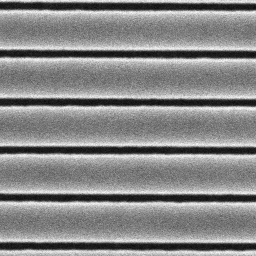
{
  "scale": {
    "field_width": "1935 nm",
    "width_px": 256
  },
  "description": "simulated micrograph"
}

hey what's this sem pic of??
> lines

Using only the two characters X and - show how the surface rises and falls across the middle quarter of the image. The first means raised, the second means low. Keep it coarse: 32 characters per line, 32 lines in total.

XXXXXXXXXXXXXXXXXXXXXXXXXXXXXXXX
XXXXXXXXXXXXXXXXXXXXXXXXXXXXXXXX
XXXXXXXXXXXXXXXXXXXXXXXXXXXXXXXX
XXXXXXXXXXXXXXXXXXXXXXXXXXXXXXXX
XXXXXXXXXXXXXXXXXXXXXXXXXXXXXXXX
XXXXXXXXXXXXXXXXXXXXXXXXXXXXXXXX
XXXXXXXXXXXXXXXXXXXXXXXXXXXXXXXX
XXXXXXXXXXXXXXXXXXXXXXXXXXXXXXXX
-----------------XXX-X-XXXXX--XX
--------------------------------
XXX------X---------XX-----------
XXXXXXXXXXXXXXXXXXXXXXXXXXXXXXXX
XXXXXXXXXXXXXXXXXXXXXXXXXXXXXXXX
XXXXXXXXXXXXXXXXXXXXXXXXXXXXXXXX
XXXXXXXXXXXXXXXXXXXXXXXXXXXXXXXX
XXXXXXXXXXXXXXXXXXXXXXXXXXXXXXXX
XXXXXXXXXXXXXXXXXXXXXXXXXXXXXXXX
XXXXXXXXXXXXXXXXXXXXXXXXXXXXXXXX
XXXXXXXXXXXXXXXXXXXXXXXXXXXXXXXX
XXXXXXXXXXXXXXXXXXXXXXXXXXXXXXXX
----------------------------X-X-
--------------------------------
--------------------------------
XXXXXXXXXXXXXXXXXXXXXXXXXXXXXXXX
XXXXXXXXXXXXXXXXXXXXXXXXXXXXXXXX
XXXXXXXXXXXXXXXXXXXXXXXXXXXXXXXX
XXXXXXXXXXXXXXXXXXXXXXXXXXXXXXXX
XXXXXXXXXXXXXXXXXXXXXXXXXXXXXXXX
XXXXXXXXXXXXXXXXXXXXXXXXXXXXXXXX
XXXXXXXXXXXXXXXXXXXXXXXXXXXXXXXX
XXXXXXXXXXXXXXXXXXXXXXXXXXXXXXXX
XXXXXXXXXXXXXXXXXXXXXXXXXXXXXXXX